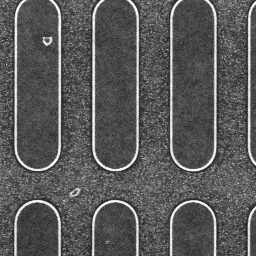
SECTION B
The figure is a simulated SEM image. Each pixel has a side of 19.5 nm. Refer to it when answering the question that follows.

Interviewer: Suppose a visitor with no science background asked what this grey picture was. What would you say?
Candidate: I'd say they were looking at groups of lines, slits or small figures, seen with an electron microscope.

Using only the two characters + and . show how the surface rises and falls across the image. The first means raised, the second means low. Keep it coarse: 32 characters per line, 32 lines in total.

...++++.....+++++.....++++......
..+++++.....+++++.....+++++....+
..+++++.....+++++....++++++....+
..+++++.....+++++....++++++....+
..+++++.....+++++....++++++....+
..+++++.....+++++....++++++....+
..+++++.....+++++....++++++....+
..+++++.....+++++....++++++....+
..+++++.....+++++....++++++....+
..+++++.....+++++....++++++....+
..+++++.....+++++....++++++....+
..+++++.....+++++....++++++....+
..+++++.....+++++....++++++....+
..+++++.....+++++....++++++....+
..+++++.....+++++....++++++....+
..+++++.....+++++....++++++....+
..+++++.....+++++....++++++....+
..+++++.....+++++....++++++....+
..+++++.....+++++....++++++....+
..+++++.....+++++.....+++++....+
...++++......+++......++++......
................................
................................
................................
................................
...+++.......+++.......++.......
..+++++.....+++++.....++++......
..+++++.....+++++....++++++....+
..+++++.....+++++....++++++....+
..+++++.....+++++....++++++....+
..+++++.....+++++....++++++....+
..+++++.....+++++....++++++....+